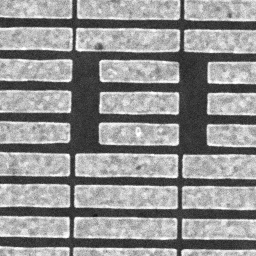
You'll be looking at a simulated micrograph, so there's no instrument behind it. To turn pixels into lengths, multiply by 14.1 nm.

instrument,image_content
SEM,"wiring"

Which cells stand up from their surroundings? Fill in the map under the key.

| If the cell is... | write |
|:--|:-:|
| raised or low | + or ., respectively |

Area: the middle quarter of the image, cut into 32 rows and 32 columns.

++.......++++++++++++++++++++...
++.......++++++++++++++++++++...
++.......++++++++++++++++++++...
++.......++++++++++++++++++++...
.................+++++++++++....
................................
................................
++.......+++++++++++++++++++....
++.......++++++++++++++++++++...
++.......++++++++++++++++++++...
++.......++++++++++++++++++++...
++.......++++++++++++++++++++...
................................
................................
................................
+........++++++++++++++++++++...
+........++++++++++++++++++++...
+........++++++++++++++++++++...
+........++++++++++++++++++++...
+........++++++++++++++++++++...
................................
................................
................................
+..+++++++++++++++++++++++++..++
+..+++++++++++++++++++++++++..++
+..+++++++++++++++++++++++++..++
+..+++++++++++++++++++++++++..++
+..+++++++++++++++++++++++++..++
................................
................................
+...............................
+..+++++++++++++++++++++++++..++